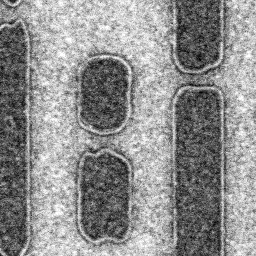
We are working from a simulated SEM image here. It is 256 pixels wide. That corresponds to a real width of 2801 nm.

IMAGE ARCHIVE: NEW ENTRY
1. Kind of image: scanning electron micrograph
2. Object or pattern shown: one or a few lines or trenches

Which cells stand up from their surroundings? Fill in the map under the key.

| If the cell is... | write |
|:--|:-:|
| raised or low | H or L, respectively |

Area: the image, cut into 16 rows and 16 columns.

LLLLLLLLLLLHHHLL
LLLLLLLLLLLHHHLL
HHLLLLLLLLLHHHLL
HHLLLLLLLLLHHHLL
HHLLLHHHLLLLLLLL
HHLLLHHHLLLLLLLL
HHLLLHHHLLLHHHLL
HHLLLHHHLLLHHHLL
HHLLLLLLLLLHHHLL
HHLLLLHLLLLHHHLL
HHLLLHHHLLLHHHLL
HHLLLHHHLLLHHHLL
HHLLLHHHLLLHHHLL
HHLLLHHHLLLHHHLL
HHLLLHHHLLLHHHLL
HHLLLLLLLLLHHHLL